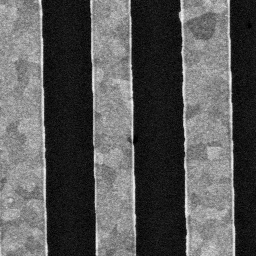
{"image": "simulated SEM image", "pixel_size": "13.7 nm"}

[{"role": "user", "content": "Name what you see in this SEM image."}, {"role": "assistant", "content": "lines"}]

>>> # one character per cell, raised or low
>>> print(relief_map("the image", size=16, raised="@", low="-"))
@@@---@@---@@@--
@@@---@@---@@@--
@@@---@@---@@@--
@@@---@@---@@@--
@@@---@@---@@@--
@@@---@@---@@@--
@@@---@@---@@@--
@@@---@@---@@@--
@@@---@@----@@--
@@@---@@----@@@-
@@@---@@----@@@-
@@@---@@----@@@-
@@@---@@----@@@-
@@@---@@----@@@-
@@@---@@----@@@-
@@@---@@----@@@-